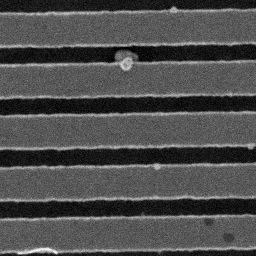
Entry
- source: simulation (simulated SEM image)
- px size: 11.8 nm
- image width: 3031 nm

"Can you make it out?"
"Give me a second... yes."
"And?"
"lines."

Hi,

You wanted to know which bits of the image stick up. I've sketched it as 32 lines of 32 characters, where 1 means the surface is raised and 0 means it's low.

00000000000000000000000000000000
00000000000011111111111111111111
11111111111111111111111111111111
11111111111111111111111111111111
11111111111111111111111111111111
11111111111111111111111111111101
00000000000000000000000000000000
00000000000000011000000000000000
11111111111111111111111111111111
11111111111111111111111111111111
11111111111111111111111111111111
11111111111111111111111111111111
00000000000000000000000000000000
00000000000000000000000000000000
01111111111111111111111111111111
11111111111111111111111111111111
11111111111111111111111111111111
11111111111111111111111111111111
11111111111111100100000000000000
00000000000000000000000000000000
00000000000000000000000000000001
11111111111111111111111111111111
11111111111111111111111111111111
11111111111111111111111111111111
11111111111111111111111111111111
00000000000000000000000000000000
00000000000000000000000000000000
11111111111111111111111111111111
11111111111111111111111111111111
11111111111111111111111111111111
11111111111111111111111111111111
11111111101000000000000000000000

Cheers